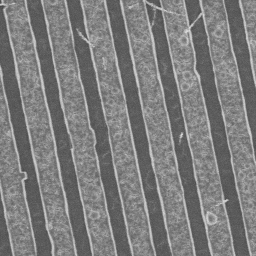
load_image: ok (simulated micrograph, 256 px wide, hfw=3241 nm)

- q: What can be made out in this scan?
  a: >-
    parallel lines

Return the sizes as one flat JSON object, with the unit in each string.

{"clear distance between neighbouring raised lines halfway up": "0.196 micrometres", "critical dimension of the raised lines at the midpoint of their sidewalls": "293 nm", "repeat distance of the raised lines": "491 nanometers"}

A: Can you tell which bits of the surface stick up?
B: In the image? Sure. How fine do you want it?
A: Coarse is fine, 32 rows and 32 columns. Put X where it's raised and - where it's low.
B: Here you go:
XXX--XXX--XXX--XXX--XXX--XXX--XX
-XX---XX--XXX--XXX--XXX--XXX--XX
-XXX--XXX--XXX--XXX-XXX---XX--XX
-XXX--XXX--XXX--XXX--XXX--XXX--X
-XXX--XXX--XXX--XXX--XXX--XXX--X
-XXX--XXX--XXX--XXX--XXX--XXX--X
--XX---XX--XXX--XXX--XXX--XXX--X
--XXX--XXX--XXX--XXX-XXX--XXX--X
--XXX--XXX--XXX--XXX--XX---XXX--
--XXX--XXX--XXX--XXX--XXX--XXX--
--XXX--XXX--XXX--XXX--XXX--XXX--
---XXX--XX--XXX--XXX--XXX--XXX--
X--XXX--XXX--XXX--XXX--XX--XXX--
X--XXX--XXX--XXX--XXX--XXX--XXX-
X--XXX--XXX--XXX--XXX--XXX--XXX-
X--XXX--XXX--XXX--XXX--XXX--XXX-
XX--XXX--XXX--XX--XXX--XXX--XXX-
XX--XXX--XXX--XXX--XXX--XX--XXX-
XX--XXX--XXX--XXX--XXX--XXX--XXX
XX--XXX--XXX--XXX--XXX--XXX--XXX
XX--XXX--XXX--XXX--XXX--XXX--XXX
XXX--XX---XX--XXX--XXX--XXX--XXX
XXX--XXX--XXX--XXX--XXX-XXXX-XXX
XXX--XXX--XXX--XXX--XXX--XXX--XX
XXX--XXX--XXX--XXX--XXX--XXX--XX
XXX--XXX--XXX--XXX--XXX--XXX--XX
-XXX--XX--XXX--XXX--XXX--XXX--XX
-XXX--XXX--XXX--XXX--XXX-XXX--XX
-XXX--XXX--XXX--XXX--XXX--XXX--X
-XXX--XXX--XXX--XXX--XXX--XXX--X
-XXX---XX--XXX--XXX--XXX--XXX--X
--XX---XX---XXX--XX--XXX--XXX--X